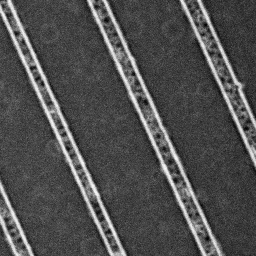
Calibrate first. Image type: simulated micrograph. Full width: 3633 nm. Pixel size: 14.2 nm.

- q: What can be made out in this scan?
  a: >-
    one or a few lines or trenches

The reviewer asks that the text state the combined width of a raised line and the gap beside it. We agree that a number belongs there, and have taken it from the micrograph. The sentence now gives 1220 nm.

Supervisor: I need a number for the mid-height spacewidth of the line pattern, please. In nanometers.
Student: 1030